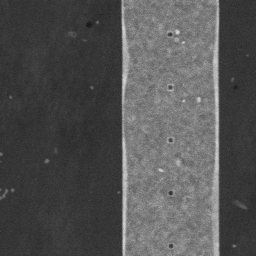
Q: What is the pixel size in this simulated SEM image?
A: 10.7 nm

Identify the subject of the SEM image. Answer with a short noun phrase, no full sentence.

wiring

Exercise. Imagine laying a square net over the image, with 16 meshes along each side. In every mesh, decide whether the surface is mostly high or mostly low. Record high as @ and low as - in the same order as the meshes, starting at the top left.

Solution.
--------@@@@@@--
--------@@@@@@--
--------@@@@@@--
--------@@@@@---
--------@@@@@---
--------@@@@@---
--------@@@@@@--
--------@@@@@@--
--------@@@@@@--
--------@@@@@@--
--------@@@@@@--
--------@@@@@---
--------@@@@@---
--------@@@@@---
--------@@@@@---
--------@@@@@---